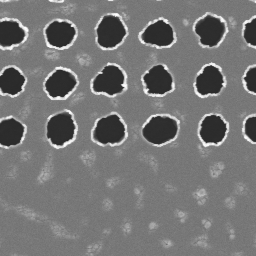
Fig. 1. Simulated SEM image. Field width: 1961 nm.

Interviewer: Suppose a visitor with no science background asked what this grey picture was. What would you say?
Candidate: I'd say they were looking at a regular array of holes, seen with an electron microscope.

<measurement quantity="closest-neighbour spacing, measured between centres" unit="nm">373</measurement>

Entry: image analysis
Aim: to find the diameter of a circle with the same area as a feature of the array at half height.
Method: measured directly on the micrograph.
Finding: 212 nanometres